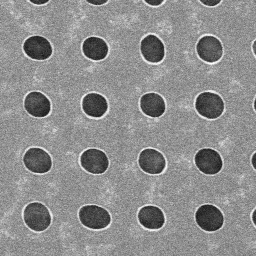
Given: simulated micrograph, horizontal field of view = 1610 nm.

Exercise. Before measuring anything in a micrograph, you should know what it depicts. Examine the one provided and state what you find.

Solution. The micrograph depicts a regular array of holes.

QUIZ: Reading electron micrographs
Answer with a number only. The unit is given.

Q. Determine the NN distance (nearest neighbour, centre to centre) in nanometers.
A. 352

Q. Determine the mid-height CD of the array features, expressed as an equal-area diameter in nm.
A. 171